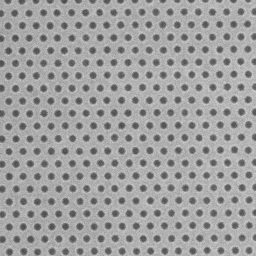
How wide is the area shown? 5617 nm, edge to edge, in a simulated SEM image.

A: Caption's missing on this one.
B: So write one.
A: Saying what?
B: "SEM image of a regular array of holes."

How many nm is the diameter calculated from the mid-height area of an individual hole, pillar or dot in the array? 184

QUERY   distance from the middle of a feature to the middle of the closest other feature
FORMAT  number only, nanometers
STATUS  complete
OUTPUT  305